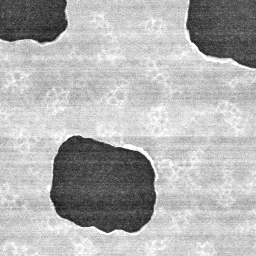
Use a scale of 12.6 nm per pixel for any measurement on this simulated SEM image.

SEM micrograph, holes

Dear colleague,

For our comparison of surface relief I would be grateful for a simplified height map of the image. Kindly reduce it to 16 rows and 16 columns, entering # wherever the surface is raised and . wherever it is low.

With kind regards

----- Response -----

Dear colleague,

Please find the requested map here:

....########....
....########....
.#.#########....
#############...
################
################
################
################
################
####.....#######
###.......######
###.......######
###.......######
####......######
################
################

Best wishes